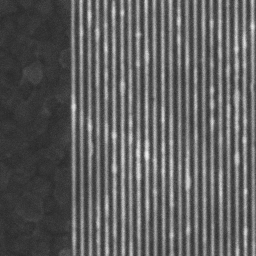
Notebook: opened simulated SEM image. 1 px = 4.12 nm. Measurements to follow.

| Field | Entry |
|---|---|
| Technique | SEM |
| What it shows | parallel lines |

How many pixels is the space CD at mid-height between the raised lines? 5.75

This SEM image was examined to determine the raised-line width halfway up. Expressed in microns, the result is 0.0119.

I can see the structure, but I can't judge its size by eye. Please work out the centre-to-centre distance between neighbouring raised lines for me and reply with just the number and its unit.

33.7 nm